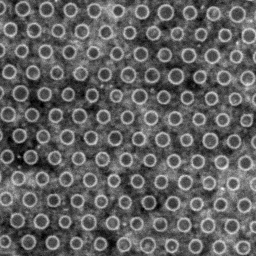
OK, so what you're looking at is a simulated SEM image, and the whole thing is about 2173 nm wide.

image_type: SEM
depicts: a regular array of raised bodies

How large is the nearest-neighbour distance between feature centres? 201 nm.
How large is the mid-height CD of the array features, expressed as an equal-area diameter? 111 nanometres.